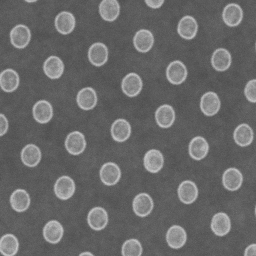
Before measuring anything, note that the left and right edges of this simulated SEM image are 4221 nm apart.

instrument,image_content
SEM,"a regular array of raised bodies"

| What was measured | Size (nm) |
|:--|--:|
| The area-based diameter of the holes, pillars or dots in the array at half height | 320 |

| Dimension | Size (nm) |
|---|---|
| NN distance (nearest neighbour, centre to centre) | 749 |